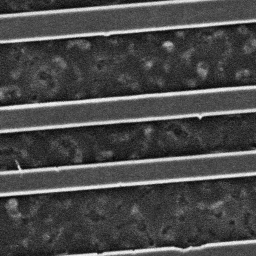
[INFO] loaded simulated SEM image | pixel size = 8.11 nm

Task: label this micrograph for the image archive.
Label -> one or a few lines or trenches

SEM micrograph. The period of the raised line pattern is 0.595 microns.